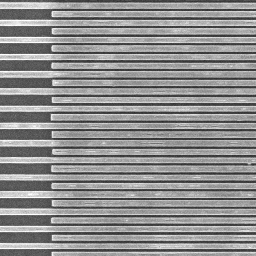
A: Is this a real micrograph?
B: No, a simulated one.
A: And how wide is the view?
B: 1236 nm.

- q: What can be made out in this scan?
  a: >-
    parallel lines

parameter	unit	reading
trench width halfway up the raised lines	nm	13.9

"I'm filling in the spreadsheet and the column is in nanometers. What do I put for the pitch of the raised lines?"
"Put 41.5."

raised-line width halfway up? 0.0278 µm